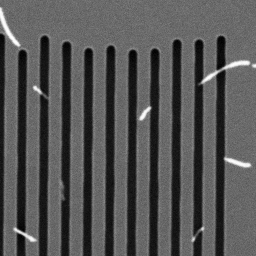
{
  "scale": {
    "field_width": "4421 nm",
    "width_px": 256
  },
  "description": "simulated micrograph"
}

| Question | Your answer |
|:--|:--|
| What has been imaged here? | groups of lines, slits or small figures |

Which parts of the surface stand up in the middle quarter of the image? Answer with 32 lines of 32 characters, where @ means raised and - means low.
--@@@--@@@---@@@---@@---@@@--@@@
--@@@--@@@---@@@---@@---@@@--@@@
--@@@--@@@---@@@---@@---@@@--@@@
--@@@--@@@---@@@---@@---@@@--@@@
--@@@--@@@---@@@---@@---@@@--@@@
--@@@--@@@---@@@--@@@---@@@--@@@
--@@@--@@@---@@@--@@@---@@@--@@@
--@@@--@@@---@@@---@@---@@@--@@@
--@@@--@@@---@@@---@@---@@@--@@@
--@@@--@@@---@@@--@@@---@@@--@@@
--@@@--@@@---@@@--@@@@--@@@--@@@
--@@@--@@@---@@@--@@@---@@@--@@@
--@@@--@@@---@@@--@@@---@@@--@@@
--@@@--@@@---@@@--@@@---@@@--@@@
--@@@--@@@---@@@--@@@---@@@--@@@
--@@@--@@@---@@@--@@@---@@@--@@@
--@@@--@@@---@@@--@@@---@@@--@@@
--@@@--@@@---@@@--@@@---@@@--@@@
--@@@--@@@---@@@--@@@---@@@--@@@
--@@@--@@@---@@@--@@@---@@@--@@@
--@@@--@@@---@@@--@@@---@@@--@@@
--@@@--@@@---@@@--@@@---@@@--@@@
--@@@--@@@---@@@--@@@---@@@--@@@
--@@@--@@@---@@@--@@@---@@@--@@@
--@@@--@@@---@@@--@@@---@@@--@@@
--@@@--@@@---@@@--@@@---@@@--@@@
--@@@--@@@---@@@--@@@---@@@--@@@
--@@@--@@@---@@@--@@@---@@@--@@@
--@@@--@@@---@@@--@@@---@@@--@@@
--@@@--@@@---@@@--@@@---@@@--@@@
--@@@--@@@---@@@--@@@---@@@--@@@
--@@@--@@@---@@@--@@@---@@@--@@@